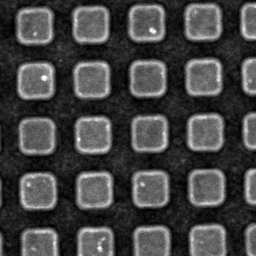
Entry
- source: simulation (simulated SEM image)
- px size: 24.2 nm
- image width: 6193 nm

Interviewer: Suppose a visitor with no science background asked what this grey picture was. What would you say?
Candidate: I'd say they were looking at a regular array of raised bodies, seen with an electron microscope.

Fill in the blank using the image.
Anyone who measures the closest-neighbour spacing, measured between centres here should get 1330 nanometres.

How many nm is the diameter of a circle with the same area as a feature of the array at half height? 940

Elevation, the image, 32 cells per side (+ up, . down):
...............................+
...+++...++++...++++...+++++..++
..+++++..++++...+++++..+++++..++
..+++++..++++...+++++..+++++..++
..+++++..++++...++++...++++....+
................................
................................
...............................+
...++++..+++++..+++++..+++++..++
..+++++..+++++..+++++..+++++..++
..+++++..+++++..+++++..+++++..++
..+++++..+++++..++++....+++....+
................................
................................
........................+++....+
...++++..+++++...++++..+++++...+
..+++++...++++...++++..+++++...+
..+++++...++++...++++...++++...+
...++++...++++...++++...+++....+
................................
................................
..................++....++++...+
...++++...++++...++++...++++...+
...++++...++++...++++...++++...+
...++++...++++...++++...++++...+
...++++...++++...++++...+++....+
................................
................................
.................++++...++++...+
...++++...++++...++++...++++...+
...++++...++++...++++...++++...+
...++++...++++...++++...++++...+